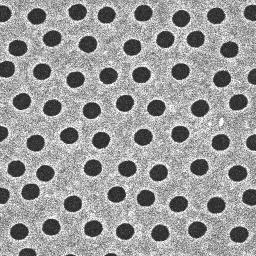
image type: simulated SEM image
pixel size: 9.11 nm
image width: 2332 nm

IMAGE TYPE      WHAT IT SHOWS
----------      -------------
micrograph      a regular array of holes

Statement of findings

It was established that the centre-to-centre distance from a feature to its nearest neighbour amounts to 286 nanometers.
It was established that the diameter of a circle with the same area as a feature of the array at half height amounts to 161 nm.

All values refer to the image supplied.